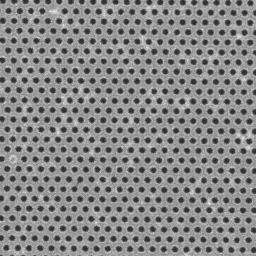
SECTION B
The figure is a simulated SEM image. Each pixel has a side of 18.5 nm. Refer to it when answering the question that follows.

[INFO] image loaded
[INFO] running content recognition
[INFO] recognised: a regular array of holes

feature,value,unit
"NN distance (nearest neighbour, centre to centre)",205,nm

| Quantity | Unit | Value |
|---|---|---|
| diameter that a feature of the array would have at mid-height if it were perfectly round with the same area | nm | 120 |